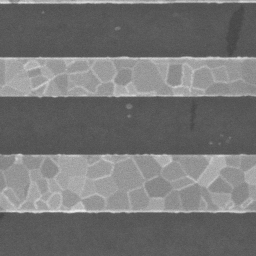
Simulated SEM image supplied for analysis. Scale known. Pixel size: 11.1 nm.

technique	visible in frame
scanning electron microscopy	lines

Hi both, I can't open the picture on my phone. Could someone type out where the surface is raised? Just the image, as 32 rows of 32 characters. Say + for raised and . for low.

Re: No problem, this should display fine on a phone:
................................
................................
................................
................................
................................
................................
................................
++++++++++++++++++++++++++++++++
++++++++++++++++++++++++++++++++
++++++++++++++++++++++++++++++++
++++++++++++++++++++++++++++++++
++++++++++++++++++++++++++++++++
................................
................................
................................
................................
................................
................................
................................
++++++++++++++++++++++++++++++++
++++++++++++++++++++++++++++++++
++++++++++++++++++++++++++++++++
++++++++++++++++++++++++++++++++
++++++++++++++++++++++++++++++++
++++++++++++++++++++++++++++++++
++++++++++++++++++++++++++++++++
....+.....................+..+..
................................
................................
................................
................................
................................